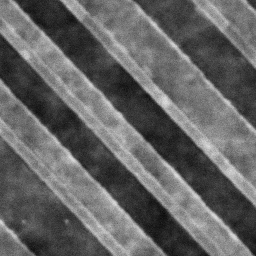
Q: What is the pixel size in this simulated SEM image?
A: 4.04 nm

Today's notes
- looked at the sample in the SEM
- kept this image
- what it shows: lines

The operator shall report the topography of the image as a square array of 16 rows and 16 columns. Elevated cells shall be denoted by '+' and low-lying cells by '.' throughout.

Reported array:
+...+++++...++++
++...+++++...+++
+++...+++++...++
.+++...+++++...+
..+++...+++++...
...+++...++++...
+...+++...++++..
++...+++...++++.
+++...+++...++++
.+++...+++...+++
..+++...+++...++
...+++...+++...+
....+++...+++...
.....+++...+++..
+.....+++...+++.
++.....+++...++.